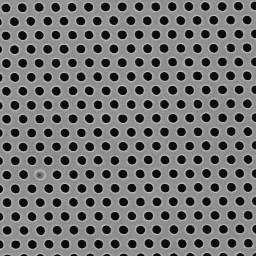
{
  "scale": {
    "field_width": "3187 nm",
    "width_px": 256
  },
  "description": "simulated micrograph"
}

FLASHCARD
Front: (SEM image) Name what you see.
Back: a regular array of holes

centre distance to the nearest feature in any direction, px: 16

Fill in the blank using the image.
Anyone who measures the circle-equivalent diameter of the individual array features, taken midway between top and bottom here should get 0.109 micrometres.